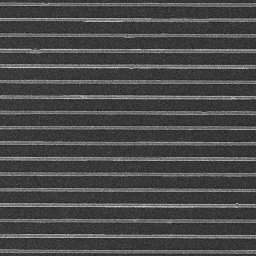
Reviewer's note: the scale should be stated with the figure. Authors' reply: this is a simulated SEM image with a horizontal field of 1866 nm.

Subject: parallel lines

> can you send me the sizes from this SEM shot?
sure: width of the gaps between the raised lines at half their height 93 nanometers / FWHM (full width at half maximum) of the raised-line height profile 21.9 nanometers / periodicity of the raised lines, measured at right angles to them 15.4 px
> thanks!